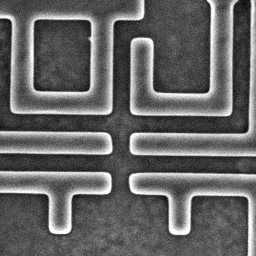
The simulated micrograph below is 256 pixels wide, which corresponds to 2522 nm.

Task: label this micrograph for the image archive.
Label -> wiring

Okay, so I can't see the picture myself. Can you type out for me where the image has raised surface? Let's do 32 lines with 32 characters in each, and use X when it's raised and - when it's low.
XXXXXXXXXXXXXXXXXX--------XXX--X
XXXXXXXXXXXXXXXXXX--------XXX--X
-XXXX------XXXX-----------XXX--X
--XX-------XXX------------XXX--X
--XX-------XXX------------XXX--X
--XX-------XXX--XXX-------XXX--X
--XX-------XXX--XXX-------XXX--X
--XX-------XXX--XXX-------XXX--X
--XX-------XXX--XXX-------XXX--X
-XXX-------XXX--XXX-------XXX--X
-XXX-------XXX--XXX-------XXX--X
-XXXX------XXX--XXXX------XXX--X
-XXXXXXXXXXXXX--XXXXXXXXXXXXX--X
-XXXXXXXXXXXXX--XXXXXXXXXXXXX--X
-------------------------------X
-------------------------------X
X------------------------------X
XXXXXXXXXXXXXX--XXXXXXXXXXXXXXXX
XXXXXXXXXXXXXX--XXXXXXXXXXXXXXXX
--------------------------------
--------------------------------
XX------------------------------
XXXXXXXXXXXXXX--XXXXXXXXXXXXXXXX
XXXXXXXXXXXXXX--XXXXXXXXXXXXXXXX
------XXX------------XXX------XX
------XXX------------XXX-------X
------XXX------------XXX-------X
------XXX------------XXX-------X
------XXX------------XXX-------X
-------------------------------X
-------------------------------X
-------------------------------X